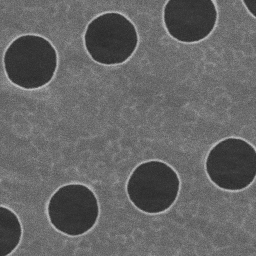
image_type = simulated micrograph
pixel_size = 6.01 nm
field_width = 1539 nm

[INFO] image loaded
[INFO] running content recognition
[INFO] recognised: holes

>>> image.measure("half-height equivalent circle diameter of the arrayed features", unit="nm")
316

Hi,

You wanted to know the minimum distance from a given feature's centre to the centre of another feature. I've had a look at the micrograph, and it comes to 500 nm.